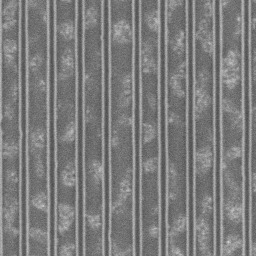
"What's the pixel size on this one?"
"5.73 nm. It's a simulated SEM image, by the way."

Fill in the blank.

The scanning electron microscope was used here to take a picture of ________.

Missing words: parallel lines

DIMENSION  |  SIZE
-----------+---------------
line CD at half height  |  43.7 nanometers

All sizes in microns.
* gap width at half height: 0.116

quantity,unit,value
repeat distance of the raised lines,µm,0.16